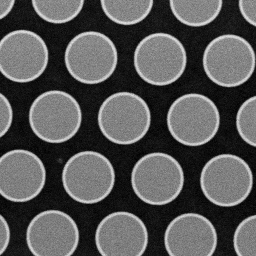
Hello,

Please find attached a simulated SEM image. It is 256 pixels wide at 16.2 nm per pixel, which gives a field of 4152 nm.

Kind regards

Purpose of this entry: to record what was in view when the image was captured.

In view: an array of small figures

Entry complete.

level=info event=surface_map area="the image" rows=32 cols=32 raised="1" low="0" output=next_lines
11001111110001111110011111110011
10000111110001111110001111100011
00000011100000111100001111100001
00000000000000000000000000000000
01111000001110000001100000001100
11111100011111000111111000111110
11111100111111100111111000111111
11111100111111100111111001111111
11111100111111000111111000111111
01111000011111000011110000111110
00000000000000000001100000011100
00000011000000000000000000000000
10001111100001111100001111000001
10001111110001111110011111100011
10001111110011111110011111100011
10001111110011111110011111100011
10001111110001111100011111100011
00000111000000111000001111000001
00000000000000000000000000000000
11111000011110000011100000011000
11111000111111000111110000111110
11111100111111000111111001111110
11111100111111001111111001111110
11111000111111000111111001111110
11110000011110000111110000111110
00000000000000000001100000011100
00000011000000000000000000000000
10001111100001111100001111000001
10001111110011111100011111100011
10011111110011111100011111100111
10011111110011111100011111100111
00001111100011111100011111100011